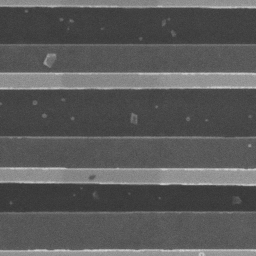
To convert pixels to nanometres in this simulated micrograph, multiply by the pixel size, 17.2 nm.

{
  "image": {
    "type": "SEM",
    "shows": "lines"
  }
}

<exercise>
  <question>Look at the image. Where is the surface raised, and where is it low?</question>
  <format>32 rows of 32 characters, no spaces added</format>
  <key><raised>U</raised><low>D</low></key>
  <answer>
UUUUUUUUUUUUUUUUUUUUUUUUUUUUUUUU
DDDDDDDDDDDDDDDDDDDDDDDDDDDDDDDD
DDDDDDDDDDDDDDDDDDDDDDDDDDDDDDDD
DDDDDDDDDDDDDDDDDDDDDDDDDDDDDDDD
DDDDDDDDDDDDDDDDDDDDDDDDDDDDDDDD
DDDDDDDDDDDDDDDDDDDDDDDDDDDDDDDD
UUUUUUUUUUUUUUUUUUUUUUUUUUUUUUUU
UUUUUUUUUUUUUUUUUUUUUUUUUUUUUUUU
UUUUUUUUUUUUUUUUUUUUUUUUUUUUUUUU
UUUUUUUUUUUUUUUUUUUUUUUUUUUUUUUU
UUUUUUUUUUUUUUUUUUUUUUUUUUUUUUUU
DDDDDDDDDDDDDDDDDDDDDDDDDDDDDDDD
DDDDDDDDDDDDDDDDDDDDDDDDDDDDDDDD
DDDDDDDDDDDDDDDDDDDDDDDDDDDDDDDD
DDDDDDDDDDDDDDDDDDDDDDDDDDDDDDDD
DDDDDDDDDDDDDDDDDDDDDDDDDDDDDDDD
DDDDDDDDDDDDDDDDDDDDDDDDDDDDDDDD
UUUUUUUUUUUUUUUUUUUUUUUUUUUUUUUU
UUUUUUUUUUUUUUUUUUUUUUUUUUUUUUUU
UUUUUUUUUUUUUUUUUUUUUUUUUUUUUUUU
UUUUUUUUUUUUUUUUUUUUUUUUUUUUUUUU
UUUUUUUUUUUUUUUUUUUUUUUUUUUUUUUU
UUUUUUUUUUUUUUUUUUUUUUUUUUUUUUUU
DDDDDDDDDDDDDDDDDDDDDDDDDDDDDDDD
DDDDDDDDDDDDDDDDDDDDDDDDDDDDDDDD
DDDDDDDDDDDDDDDDDDDDDDDDDDDDDDDD
DDDDDDDDDDDDDDDDDDDDDDDDDDDDDDDD
UUUUUUUUUUUUUUUUUUUUUUUUUUUUUUUU
UUUUUUUUUUUUUUUUUUUUUUUUUUUUUUUU
UUUUUUUUUUUUUUUUUUUUUUUUUUUUUUUU
UUUUUUUUUUUUUUUUUUUUUUUUUUUUUUUU
UUUUUUUUUUUUUUUUUUUUUUUUUUUUUUUU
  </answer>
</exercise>